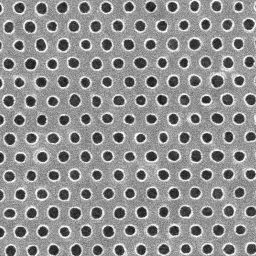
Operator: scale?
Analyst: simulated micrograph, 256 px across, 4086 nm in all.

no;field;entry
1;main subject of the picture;a regular array of holes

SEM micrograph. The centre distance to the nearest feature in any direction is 21.1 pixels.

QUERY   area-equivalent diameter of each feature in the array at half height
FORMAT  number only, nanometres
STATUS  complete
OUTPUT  177